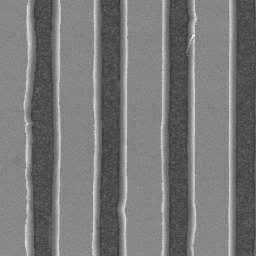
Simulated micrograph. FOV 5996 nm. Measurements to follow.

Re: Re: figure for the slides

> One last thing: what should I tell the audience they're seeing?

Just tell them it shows one or a few lines or trenches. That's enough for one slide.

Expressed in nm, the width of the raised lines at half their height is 987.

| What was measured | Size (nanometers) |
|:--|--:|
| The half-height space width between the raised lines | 588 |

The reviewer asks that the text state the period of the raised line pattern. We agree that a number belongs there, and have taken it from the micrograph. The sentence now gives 67.5 pixels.